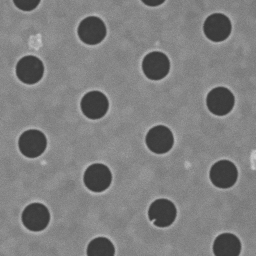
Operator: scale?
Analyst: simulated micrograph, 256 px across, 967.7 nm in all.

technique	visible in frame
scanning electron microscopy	a regular array of holes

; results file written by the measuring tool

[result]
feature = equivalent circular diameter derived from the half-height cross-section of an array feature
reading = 109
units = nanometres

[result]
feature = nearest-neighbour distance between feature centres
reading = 0.274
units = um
